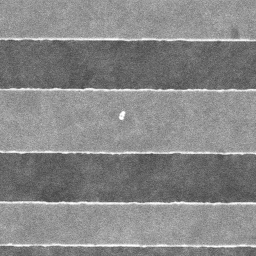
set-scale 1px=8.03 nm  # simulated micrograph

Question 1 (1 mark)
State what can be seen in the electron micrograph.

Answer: lines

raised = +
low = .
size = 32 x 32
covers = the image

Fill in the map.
++++++++++++++++++++++++++++++++
++++++++++++++++++++++++++++++++
++++++++++++++++++++++++++++++++
++++++++++++++++++++++++++++++++
++++++++++++++++++++++++++++++++
................................
................................
................................
................................
................................
................................
++++++++++++++++++++++++++++++++
++++++++++++++++++++++++++++++++
++++++++++++++++++++++++++++++++
++++++++++++++++++++++++++++++++
++++++++++++++++++++++++++++++++
++++++++++++++++++++++++++++++++
++++++++++++++++++++++++++++++++
++++++++++++++++++++++++++++++++
................................
................................
................................
................................
................................
................................
++++++++++++++++++++++++++++++++
++++++++++++++++++++++++++++++++
++++++++++++++++++++++++++++++++
++++++++++++++++++++++++++++++++
++++++++++++++++++++++++++++++++
++++++++++++++++++++++++++++++++
................................